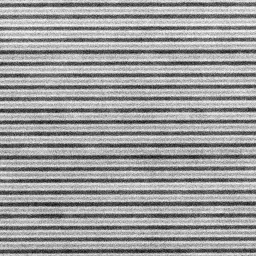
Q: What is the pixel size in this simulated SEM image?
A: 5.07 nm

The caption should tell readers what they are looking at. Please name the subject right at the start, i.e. parallel lines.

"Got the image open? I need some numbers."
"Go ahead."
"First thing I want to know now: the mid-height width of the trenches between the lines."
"25.4 nm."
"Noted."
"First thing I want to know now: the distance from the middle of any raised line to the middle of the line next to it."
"59.5 nanometres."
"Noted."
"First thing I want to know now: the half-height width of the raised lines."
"30.4 nanometres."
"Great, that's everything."